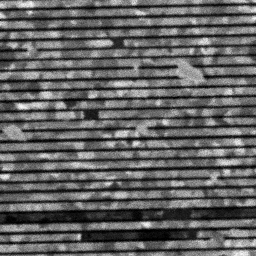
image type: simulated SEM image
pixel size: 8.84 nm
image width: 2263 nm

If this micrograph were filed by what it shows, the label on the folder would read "parallel lines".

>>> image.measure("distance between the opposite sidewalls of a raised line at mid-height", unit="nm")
57.4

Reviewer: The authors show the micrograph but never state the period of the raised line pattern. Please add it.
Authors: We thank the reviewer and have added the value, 10.2 px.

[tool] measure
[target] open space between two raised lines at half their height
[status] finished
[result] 25.4 nanometers